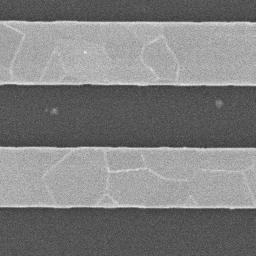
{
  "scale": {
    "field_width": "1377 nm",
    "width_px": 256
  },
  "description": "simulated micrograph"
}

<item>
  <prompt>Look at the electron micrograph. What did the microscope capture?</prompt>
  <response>wiring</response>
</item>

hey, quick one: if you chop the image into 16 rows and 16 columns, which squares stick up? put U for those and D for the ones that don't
DDDDDDDDDDDDDDDD
UUUUUUUUUUUUUUUU
UUUUUUUUUUUUUUUU
UUUUUUUUUUUUUUUU
UUUUUUUUUUUUUUUU
DDDDDDDDDDDDDDDD
DDDDDDDDDDDDDDDD
DDDDDDDDDDDDDDDD
DDDDDDDDDDDDDDDD
UUUUUUUUUUUUUUUU
UUUUUUUUUUUUUUUU
UUUUUUUUUUUUUUUU
UUUUUUUUUUUUUUUU
DDDDDDDDDDDDDDDD
DDDDDDDDDDDDDDDD
DDDDDDDDDDDDDDDD